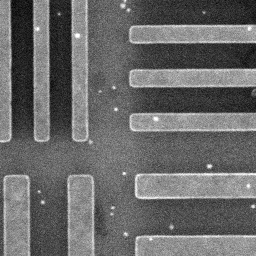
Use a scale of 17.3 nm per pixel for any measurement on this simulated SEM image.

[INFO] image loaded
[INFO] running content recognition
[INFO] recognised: groups of lines, slits or small figures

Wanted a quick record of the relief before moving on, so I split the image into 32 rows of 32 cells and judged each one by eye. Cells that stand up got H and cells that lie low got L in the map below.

HLLLHHLLLHHLLLLLLLLLLLLLLLLLLLLL
HLLLHHLLLHHLLLLLLLLLLLLLLLLLLLLL
HLLLHHLLLHHLLLLLLLLLLLLLLLLLLLLL
HLLLHHLLLHHLLLLLLHHHHHHHHHHHHHHH
HLLLHHLLLHHLLLLLHHHHHHHHHHHHHHHH
HLLLHHLLLHHLLLLLLLLLLLLLLLLLLLLL
HLLLHHLLLHHLLLLLLLLLLLLLLLLLLLLL
HLLLHHLLLHHLLLLLLLLLLLLLLLLLLLLL
HLLLHHLLLHHLLLLLLLLLLLLLLLLLLLLL
HLLLHHLLLHHLLLLLHHHHHHHHHHHHHHHH
HLLLHHLLLHHLLLLLHHHHHHHHHHHHHHHH
HLLLHHLLLHHLLLLLLLLLLLLLLLLLLLLL
HLLLHHLLLHHLLLLLLLLLLLLLLLLLLLLL
HLLLHHLLLHHLLLLLLLLLLLLLLLLLLLLL
HLLLHHLLLHHLLLLLHHHHHHHHHHHHHHHH
HLLLHHLLLHHLLLLLHHHHHHHHHHHHHHHH
HLLLHHLLLHHLLLLLLLLLLLLLLLLLLLLL
HLLLLHLLLHLLLLLLLLLLLLLLLLLLLLLL
LLLLLLLLLLLLLLLLLLLLLLLLLLLLLLLL
LLLLLLLLLLLLLLLLLLLLLLLLLLLLLLLL
LLLLLLLLLLLLLLLLLLLLLLLLLLLLLLLL
LLLLLLLLLLLLLLLLLLLLLLLLLLLLLLLL
LHHHLLLLLHHHLLLLLHHHHHHHHHHHHHHH
LHHHLLLLLHHHLLLLLHHHHHHHHHHHHHHH
LHHHLLLLLHHHLLLLLHHHHHHHHHHHHHHH
LHHHLLLLLHHHLLLLLLLLLLLLLLLLLLLL
LHHHLLLLLHHHLLLLLLLLLLLLLLLLLLLL
LHHHLLLLLHHHLLLLLLLLLLLLLLLLLLLL
LHHHLLLLLHHHLLLLLLLLLLLLLLLLLLLL
LHHHLLLLLHHHLLLLLLLLLLLLLLLLLLLL
LHHHLLLLLHHHLLLLLHHHHHHHHHHHHHHH
LHHHLLLLLHHHLLLLLHHHHHHHHHHHHHHH